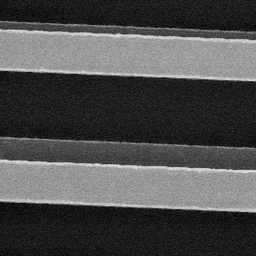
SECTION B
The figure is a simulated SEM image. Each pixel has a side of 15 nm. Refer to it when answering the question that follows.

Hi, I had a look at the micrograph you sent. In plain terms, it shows lines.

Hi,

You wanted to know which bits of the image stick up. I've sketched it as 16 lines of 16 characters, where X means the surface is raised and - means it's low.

----------------
XXXX------------
XXXXXXXXXXXXXXXX
XXXXXXXXXXXXXXXX
--XXXXXXXXXXXXXX
----------------
----------------
----------------
----------------
XXXXXXXXXXXXXXXX
XXXXXXXXXXXXXXXX
XXXXXXXXXXXXXXXX
XXXXXXXXXXXXXXXX
----------------
----------------
----------------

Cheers